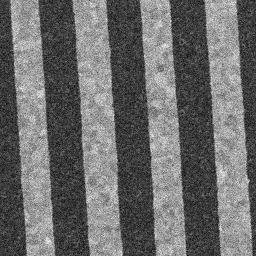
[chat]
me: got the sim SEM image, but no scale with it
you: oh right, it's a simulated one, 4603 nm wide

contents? one or a few lines or trenches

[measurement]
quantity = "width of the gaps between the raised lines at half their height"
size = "630 nm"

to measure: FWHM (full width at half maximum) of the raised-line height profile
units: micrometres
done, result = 0.538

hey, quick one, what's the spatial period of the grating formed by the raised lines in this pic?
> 1170 nanometres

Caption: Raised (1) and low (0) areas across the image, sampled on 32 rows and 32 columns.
01111000011110000011100000111100
01111000011110000011100000111100
00111000011110000011100000111100
00111000011110000011100000111100
00111000001111000011100000111100
00111000001111000011100000111100
00111000001111000011110000111100
00111000001111000011110000111100
00111000001111000011110000111100
00111000001111000011110000111100
00111000001111000011110000111100
00111100001111000011110000111100
00111100001111000011110000011100
00111100001111000001110000011100
00111100001111000001110000011100
00111100001111000001110000011100
00111100001111000001110000011110
00111100001111000001110000011110
00011100001111000001110000011110
00011100001111100001111000011110
00011100001111100001111000011110
00011100011111100001111000011110
00011100000111100001111000011110
00011100000111100001111000011110
00011100000111100001111000011110
00011100000111100001111000011110
00011100000111100001111000011110
00011110000111100001111000011110
00011110000111100001111000011110
00011110000111100001111000001110
00011110000111100001111000001110
00011110000111100000111000001110